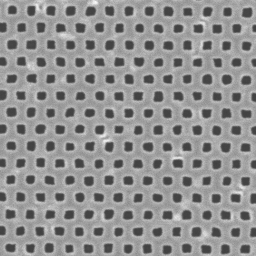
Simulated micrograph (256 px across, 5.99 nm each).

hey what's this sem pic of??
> a regular array of holes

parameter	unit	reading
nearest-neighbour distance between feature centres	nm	114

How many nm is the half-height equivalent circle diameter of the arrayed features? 60.1